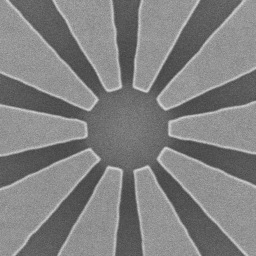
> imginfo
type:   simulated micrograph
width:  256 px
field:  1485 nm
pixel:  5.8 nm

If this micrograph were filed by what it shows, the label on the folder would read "groups of lines, slits or small figures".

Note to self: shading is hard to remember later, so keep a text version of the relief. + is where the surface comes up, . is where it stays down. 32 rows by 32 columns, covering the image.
+......+++++++....+++++++.....++
++.....+++++++...+++++++.....+++
+++.....++++++...++++++.....++++
++++.....+++++...++++++....+++++
+++++....++++++..+++++....++++++
++++++....+++++..+++++...+++++++
+++++++...+++++..++++....+++++++
++++++++...++++..++++...++++++++
+++++++++...+++..+++...+++++++++
.+++++++++..+++..+++..++++++++..
...++++++++..++..++..+++++++....
......++++++........++++++......
........++++........++++........
++........+.........+.......++++
+++++++................+++++++++
+++++++++++..........+++++++++++
+++++++++++..........+++++++++++
+++++++++..............+++++++++
+++++.......................++++
.........+++........+++.........
.......+++++........++++++......
.....++++++..++..++..+++++++....
...+++++++...++..+++..++++++++..
+++++++++...+++..+++...+++++++++
++++++++...++++..++++...++++++++
++++++++...++++..++++....+++++++
+++++++...+++++..+++++....++++++
++++++....+++++..+++++....++++++
+++++....++++++...+++++....+++++
++++.....++++++...++++++....++++
+++.....++++++....++++++.....+++
++.....+++++++....+++++++.....++